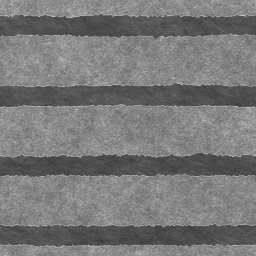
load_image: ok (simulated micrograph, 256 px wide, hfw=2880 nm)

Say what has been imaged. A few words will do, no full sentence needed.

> one or a few lines or trenches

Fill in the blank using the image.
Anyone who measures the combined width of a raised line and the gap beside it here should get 0.786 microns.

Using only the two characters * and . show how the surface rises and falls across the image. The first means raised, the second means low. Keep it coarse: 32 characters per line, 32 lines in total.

********************************
********************************
................................
................................
..*****.*.................******
********************************
********************************
********************************
********************************
********************************
*********************...**.*****
................................
................................
********************************
********************************
********************************
********************************
********************************
********************************
**..**...*..........*...........
................................
................................
********************************
********************************
********************************
********************************
********************************
********************************
................................
................................
................................
********************************